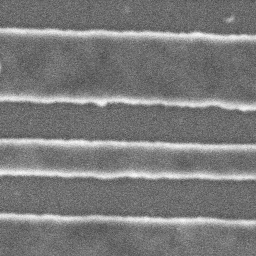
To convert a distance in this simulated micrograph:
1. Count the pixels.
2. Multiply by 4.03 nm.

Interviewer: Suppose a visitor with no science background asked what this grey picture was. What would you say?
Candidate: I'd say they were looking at lines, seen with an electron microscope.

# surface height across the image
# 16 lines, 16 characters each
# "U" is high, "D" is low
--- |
DDDDDDDDDDDDDDDD
DDDDDDDDDDDDDDDD
UUUUUUUUUUUUUUUU
UUUUUUUUUUUUUUUU
UUUUUUUUUUUUUUUU
UUUUUUUUUUUUUUUU
DDDDDDDDDDUUUUUU
DDDDDDDDDDDDDDDD
DDDDDDDDDDDDDDDD
UUUUUUUUUUUUUUUU
UUUUUUUUUUUUUUUU
DDDDDDDDDDDDDDDD
DDDDDDDDDDDDDDDD
UUUDDDDDDDDDDDDD
UUUUUUUUUUUUUUUU
UUUUUUUUUUUUUUUU